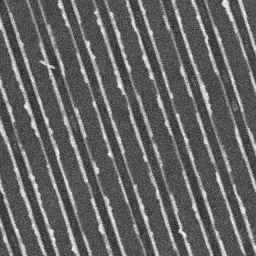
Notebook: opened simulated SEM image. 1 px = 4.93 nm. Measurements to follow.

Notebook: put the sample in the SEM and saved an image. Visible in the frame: parallel lines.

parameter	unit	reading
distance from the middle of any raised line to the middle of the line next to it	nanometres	156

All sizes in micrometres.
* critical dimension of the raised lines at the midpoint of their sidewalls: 0.107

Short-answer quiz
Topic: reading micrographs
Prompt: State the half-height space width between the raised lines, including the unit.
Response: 46.8 nanometres